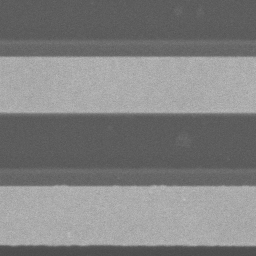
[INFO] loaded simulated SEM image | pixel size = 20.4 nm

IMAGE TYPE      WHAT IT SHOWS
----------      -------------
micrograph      lines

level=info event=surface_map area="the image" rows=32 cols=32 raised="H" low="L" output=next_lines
LLLLLLLLLLLLLLLLLLLLLLLLLLLLLLLL
LLLLLLLLLLLLLLLLLLLLLLLLLLLLLLLL
LLLLLLLLLLLLLLLLLLLLLLLLLLLLLLLL
LLLLLLLLLLLLLLLLLLLLLLLLLLLLLLLL
LLLLLLLLLLLLLLLLLLLLLLLLLLLLLLLL
LLLLLLLLLLLLLLLLLLLLLLLLLLLLLLLL
LLLLLLLLLLLLLLLLLLLLLLLLLLLLLLLL
HHHHHHHHHHHHHHHHHHHHHHHHHHHHHHHH
HHHHHHHHHHHHHHHHHHHHHHHHHHHHHHHH
HHHHHHHHHHHHHHHHHHHHHHHHHHHHHHHH
HHHHHHHHHHHHHHHHHHHHHHHHHHHHHHHH
HHHHHHHHHHHHHHHHHHHHHHHHHHHHHHHH
HHHHHHHHHHHHHHHHHHHHHHHHHHHHHHHH
HHHHHHHHHHHHHHHHHHHHHHHHHHHHHHHH
LLLLLLLLLLLLLLLLLLLLLLLLLLLLLLLL
LLLLLLLLLLLLLLLLLLLLLLLLLLLLLLLL
LLLLLLLLLLLLLLLLLLLLLLLLLLLLLLLL
LLLLLLLLLLLLLLLLLLLLLLLLLLLLLLLL
LLLLLLLLLLLLLLLLLLLLLLLLLLLLLLLL
LLLLLLLLLLLLLLLLLLLLLLLLLLLLLLLL
LLLLLLLLLLLLLLLLLLLLLLLLLLLLLLLL
LLLLLLLLLLLLLLLLLLLLLLLLLLLLLLLL
LLLLLLLLLLLLLLLLLLLLLLLLLLLLLLLL
HHHHHHHHHHHHHHHHHHHHHHHHHHHHHHHH
HHHHHHHHHHHHHHHHHHHHHHHHHHHHHHHH
HHHHHHHHHHHHHHHHHHHHHHHHHHHHHHHH
HHHHHHHHHHHHHHHHHHHHHHHHHHHHHHHH
HHHHHHHHHHHHHHHHHHHHHHHHHHHHHHHH
HHHHHHHHHHHHHHHHHHHHHHHHHHHHHHHH
HHHHHHHHHHHHHHHHHHHHHHHHHHHHHHHH
HHHHHHHHHHHHHHHHHHHHHHHHHHHHHHHH
LLLLLLLLLLLLLLLLLLLLLLLLLLLLLLLL